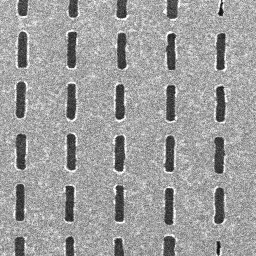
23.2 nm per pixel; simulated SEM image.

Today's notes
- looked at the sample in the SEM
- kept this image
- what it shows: a regular array of holes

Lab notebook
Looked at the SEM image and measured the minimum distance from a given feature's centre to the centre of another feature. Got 1150 nanometers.